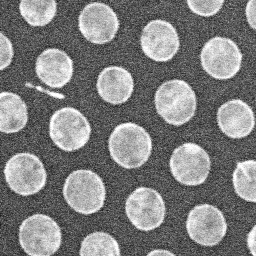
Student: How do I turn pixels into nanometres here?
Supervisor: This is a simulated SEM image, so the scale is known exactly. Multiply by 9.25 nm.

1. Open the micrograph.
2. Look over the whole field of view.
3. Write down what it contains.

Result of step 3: a regular array of raised bodies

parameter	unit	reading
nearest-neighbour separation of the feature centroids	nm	580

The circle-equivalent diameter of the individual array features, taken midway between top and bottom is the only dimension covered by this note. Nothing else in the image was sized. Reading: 363 nm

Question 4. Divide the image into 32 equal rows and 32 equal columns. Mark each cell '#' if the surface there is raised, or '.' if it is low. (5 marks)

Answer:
...####.....#...........####...#
...####...####..........###....#
...###....#####................#
..........#####...###...........
...........###....####..........
#.................####....###...
#.....##..........####...#####..
#....####...........#....#####..
.....####.....#...........####..
.....####....###...........##...
......##....#####...###.........
............####....####........
###..........###....####........
###.................####....###.
###....###..........####...#####
###...#####................#####
......#####...####..........###.
.......####...#####.............
........##....#####...###.......
..##..........####....####......
.####..........###...#####....##
.####....##...........####...###
.#####..####..........###....###
.####...#####................###
........#####...####..........##
.........####...####............
..........#.....####....###.....
...###..........####....####....
...####...........#....#####....
..#####....###..........####...#
...####...####...........##....#
...####...#####....##...........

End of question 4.